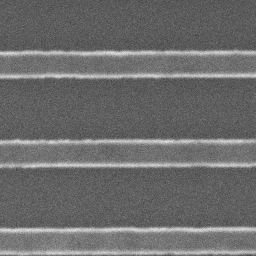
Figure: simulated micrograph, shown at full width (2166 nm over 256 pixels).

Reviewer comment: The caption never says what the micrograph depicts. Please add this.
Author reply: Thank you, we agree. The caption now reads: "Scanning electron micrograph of lines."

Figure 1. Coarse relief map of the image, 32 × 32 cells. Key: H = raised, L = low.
LLLLLLLLLLLLLLLLLLLLLLLLLLLLLLLL
LLLLLLLLLLLLLLLLLLLLLLLLLLLLLLLL
LLLLLLLLLLLLLLLLLLLLLLLLLLLLLLLL
LLLLLLLLLLLLLLLLLLLLLLLLLLLLLLLL
LLLLLLLLLLLLLLLLLLLLLLLLLLLLLLLL
LLLLLLLLLLLLLLLLLLLLLLLLLLLLLLLL
LLHHHLLHLLLLLLLLLHHHHHHHHHHHHHHH
HHHHHHHHHHHHHHHHHHHHHHHHHHHHHHHH
HHHHHHHHHHHHHHHHHHHHHHHHHHHHHHHH
HHHHHHHHHHHHHHHHHHHHHHHHHHHHHHHH
LLLLLLLLLLLLLLLLLLLLLLLLLLLLLLLL
LLLLLLLLLLLLLLLLLLLLLLLLLLLLLLLL
LLLLLLLLLLLLLLLLLLLLLLLLLLLLLLLL
LLLLLLLLLLLLLLLLLLLLLLLLLLLLLLLL
LLLLLLLLLLLLLLLLLLLLLLLLLLLLLLLL
LLLLLLLLLLLLLLLLLLLLLLLLLLLLLLLL
LLLLLLLLLLLLLLLLLLLLLLLLLLLLLLLL
LLLLLLLLLLLLLLLLLLLLLLLLLLLLLLLL
HHHHHHHHHHHHHHHHHHHHHHHHHHHHHHHH
HHHHHHHHHHHHHHHHHHHHHHHHHHHHHHHH
HHHHHHHHHHHHHHHHHHHHHHHHHHHHHHHH
LLLLLLLLLLLLLLLLLLLLLLLLLLLLLLLL
LLLLLLLLLLLLLLLLLLLLLLLLLLLLLLLL
LLLLLLLLLLLLLLLLLLLLLLLLLLLLLLLL
LLLLLLLLLLLLLLLLLLLLLLLLLLLLLLLL
LLLLLLLLLLLLLLLLLLLLLLLLLLLLLLLL
LLLLLLLLLLLLLLLLLLLLLLLLLLLLLLLL
LLLLLLLLLLLLLLLLLLLLLLLLLLLLLLLL
LLLLLLLLLLLLLLLLLLLLLLLLLLLLLLLL
HHHHHHHHHHHHHHHHHHHHHHHHHHHHHHHH
HHHHHHHHHHHHHHHHHHHHHHHHHHHHHHHH
HHHHHHHHHHHHHHHHHHHHHHHHHHHHHHHH